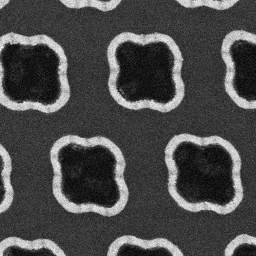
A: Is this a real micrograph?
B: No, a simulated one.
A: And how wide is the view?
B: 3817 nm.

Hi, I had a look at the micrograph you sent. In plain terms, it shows raised bodies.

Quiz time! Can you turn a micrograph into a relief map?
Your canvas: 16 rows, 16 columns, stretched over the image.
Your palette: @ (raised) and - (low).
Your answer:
----------------
----------------
@-@----@@@----@@
@@@@---@@@@---@@
@@@@---@@@@---@@
@@@@---@@@@---@@
-@@@----@@@----@
----------------
----------------
---@@@@----@@@@-
----@@@----@@@@-
----@@@@---@@@@-
----@@@@---@@@@-
----------------
----------------
@@@----@@@@---@@